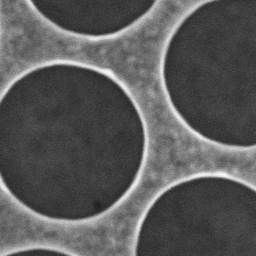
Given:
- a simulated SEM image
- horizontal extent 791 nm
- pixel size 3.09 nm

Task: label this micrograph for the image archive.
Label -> holes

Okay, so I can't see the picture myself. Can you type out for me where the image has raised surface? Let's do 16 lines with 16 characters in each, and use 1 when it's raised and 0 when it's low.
1100000001110000
1110000011100000
1111111111100000
1111111111000000
1100001111000000
1000000011000000
0000000011100000
0000000001100000
0000000001111000
0000000001111111
0000000001111111
0000000011100001
1000000111000000
1110001110000000
1111111110000000
1111111110000000